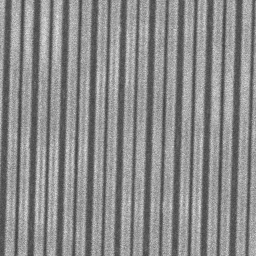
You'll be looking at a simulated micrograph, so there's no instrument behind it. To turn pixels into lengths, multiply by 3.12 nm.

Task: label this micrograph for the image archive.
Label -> parallel lines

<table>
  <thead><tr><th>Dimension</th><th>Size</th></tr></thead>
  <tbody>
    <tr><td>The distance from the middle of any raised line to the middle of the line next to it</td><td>45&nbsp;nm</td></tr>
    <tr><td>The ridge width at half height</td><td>28.4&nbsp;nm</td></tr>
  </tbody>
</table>